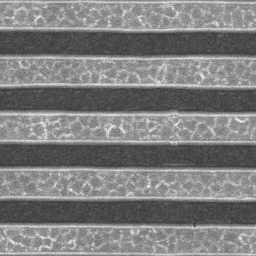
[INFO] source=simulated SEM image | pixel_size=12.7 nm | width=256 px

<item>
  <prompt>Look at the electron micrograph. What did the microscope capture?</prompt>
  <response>parallel lines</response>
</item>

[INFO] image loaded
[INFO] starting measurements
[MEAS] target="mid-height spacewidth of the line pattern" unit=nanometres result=318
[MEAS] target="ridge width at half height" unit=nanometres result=394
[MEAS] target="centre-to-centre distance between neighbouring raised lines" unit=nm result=714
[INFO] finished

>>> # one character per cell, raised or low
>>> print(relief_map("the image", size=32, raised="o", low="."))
oooooooooooooooooooooooooooooooo
oooooooooooooooooooooooooooooooo
oooooooooooooooooooooooooooooooo
oooooooooooooooooooooooooooooooo
................................
................................
................................
oooooooooooooooooooooooooooooooo
oooooooooooooooooooooooooooooooo
oooooooooooooooooooooooooooooooo
oooooooooooooooooooooooooooooooo
................................
................................
................................
oooooooooooooooooooooooooooooooo
oooooooooooooooooooooooooooooooo
oooooooooooooooooooooooooooooooo
oooooooooooooooooooooooooooooooo
................................
................................
................................
oooooooooooooooooooooooooooooooo
oooooooooooooooooooooooooooooooo
oooooooooooooooooooooooooooooooo
oooooooooooooooooooooooooooooooo
................................
................................
................................
oooooooooooooooooooooooooooooooo
oooooooooooooooooooooooooooooooo
oooooooooooooooooooooooooooooooo
oooooooooooooooooooooooooooooooo